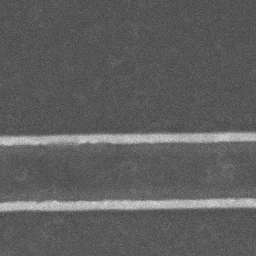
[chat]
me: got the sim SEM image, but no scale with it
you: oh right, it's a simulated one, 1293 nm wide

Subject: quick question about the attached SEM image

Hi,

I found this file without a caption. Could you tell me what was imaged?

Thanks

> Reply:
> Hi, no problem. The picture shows one or a few lines or trenches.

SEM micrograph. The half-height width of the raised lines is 0.345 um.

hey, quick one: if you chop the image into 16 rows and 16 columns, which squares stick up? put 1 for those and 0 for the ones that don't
0000000000000000
0000000000000000
0000000000000000
0000000000000000
0000000000000000
0000000000000000
0000000000000000
0000000000000000
0000000000000000
1111111111111111
1111111111111111
1111111111111111
1111111111111111
0000000000000000
0000000000000000
0000000000000000